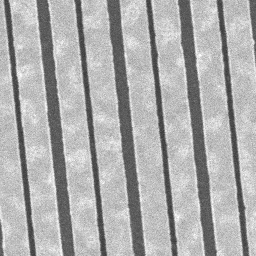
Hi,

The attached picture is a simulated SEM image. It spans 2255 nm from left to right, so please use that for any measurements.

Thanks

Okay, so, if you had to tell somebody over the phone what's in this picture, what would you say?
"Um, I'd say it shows parallel lines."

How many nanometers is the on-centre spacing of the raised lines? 314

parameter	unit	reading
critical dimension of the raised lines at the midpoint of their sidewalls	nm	224